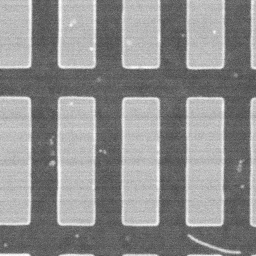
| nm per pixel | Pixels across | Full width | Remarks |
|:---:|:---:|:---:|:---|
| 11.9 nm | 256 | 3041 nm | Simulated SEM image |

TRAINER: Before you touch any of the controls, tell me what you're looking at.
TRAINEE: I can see groups of lines, slits or small figures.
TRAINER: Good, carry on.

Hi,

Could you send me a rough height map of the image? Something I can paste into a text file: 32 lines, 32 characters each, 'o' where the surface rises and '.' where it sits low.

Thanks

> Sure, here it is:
oooo....oooo...ooooo...ooooo...o
oooo....oooo...ooooo...ooooo...o
oooo....oooo...ooooo...ooooo...o
oooo....oooo...ooooo...ooooo...o
oooo...ooooo...ooooo...ooooo...o
oooo...ooooo...ooooo...ooooo...o
oooo...ooooo...ooooo...ooooo...o
oooo...ooooo...ooooo...ooooo...o
........................oo......
................................
................................
................................
oooo...ooooo....oooo...ooooo....
oooo...ooooo...ooooo...ooooo...o
oooo...ooooo...ooooo...ooooo...o
oooo...ooooo...ooooo...ooooo...o
oooo...ooooo...ooooo...ooooo...o
oooo...ooooo...ooooo...ooooo...o
oooo...ooooo...ooooo...ooooo...o
oooo...ooooo...ooooo...ooooo...o
oooo...ooooo...ooooo...ooooo...o
oooo...ooooo...ooooo...ooooo...o
oooo...ooooo...ooooo...ooooo...o
oooo...ooooo...ooooo...ooooo...o
oooo...ooooo...ooooo...ooooo...o
oooo...ooooo...ooooo...ooooo...o
oooo...ooooo...ooooo...ooooo...o
oooo...ooooo...ooooo...ooooo...o
................................
................................
................................
................................